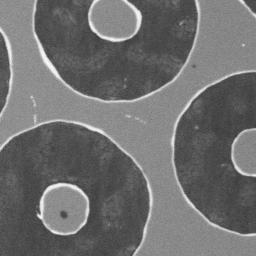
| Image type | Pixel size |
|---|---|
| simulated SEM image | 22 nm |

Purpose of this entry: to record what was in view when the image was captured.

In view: ring-shaped grooves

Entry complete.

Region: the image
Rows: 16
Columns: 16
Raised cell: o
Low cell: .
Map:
oo....oo....oooo
oo....ooo...oooo
oo..........oooo
.oo.........oooo
.oo........ooooo
.ooo......ooo...
oooooooooooo....
ooooooooooo.....
o......oooo....o
........ooo...oo
.........oo....o
.........oo.....
...oo....ooo....
...oo....oooo...
...oo....oooooo.
.........ooooooo